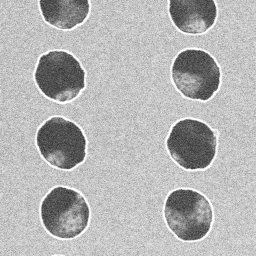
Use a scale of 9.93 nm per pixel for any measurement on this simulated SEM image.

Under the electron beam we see holes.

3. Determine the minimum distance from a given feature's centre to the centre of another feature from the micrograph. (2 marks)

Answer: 692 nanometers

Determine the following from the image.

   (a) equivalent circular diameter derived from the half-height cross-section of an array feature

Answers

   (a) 508 nanometres